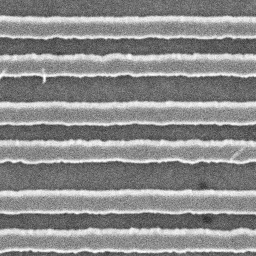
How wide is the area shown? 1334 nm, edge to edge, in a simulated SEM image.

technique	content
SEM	lines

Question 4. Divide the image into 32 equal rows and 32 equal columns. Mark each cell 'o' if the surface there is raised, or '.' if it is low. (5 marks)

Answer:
................................
................................
oooooooooooooooooooooooooooooooo
oooooooooooooooooooooooooooooooo
oooooooooooooooooooooooooooooooo
................................
................................
oooooooooooooooooooooooooooooooo
oooooooooooooooooooooooooooooooo
ooo..oo.oooo.oo.oo.....oo....ooo
................................
................................
................................
oooooooooooooooooooooooooooooooo
oooooooooooooooooooooooooooooooo
oooo....oooooooo...oo...o..ooooo
................................
................................
oooooooooooooooooooooooooooooooo
oooooooooooooooooooooooooooooooo
................................
................................
................................
................................
oooooooooooooooooooooooooooooooo
oooooooooooooooooooooooooooooooo
oooooooooooooooooo.ooooooooooooo
................................
................................
oooooooooooooooooooooooooooooooo
oooooooooooooooooooooooooooooooo
o......ooo.oo..oooooooo......o..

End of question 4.